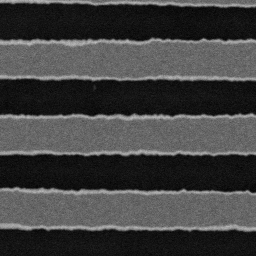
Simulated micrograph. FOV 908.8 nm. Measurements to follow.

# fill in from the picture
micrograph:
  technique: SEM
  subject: lines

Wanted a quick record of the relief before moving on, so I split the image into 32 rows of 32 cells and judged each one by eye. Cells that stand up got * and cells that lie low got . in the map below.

...........****.****************
................................
................................
................................
................................
********************************
********************************
********************************
********************************
********************************
................................
................................
................................
................................
******.****.*********.****.*****
********************************
********************************
********************************
********************************
................................
................................
................................
................................
................................
********************************
********************************
********************************
********************************
*.******************************
................................
................................
................................